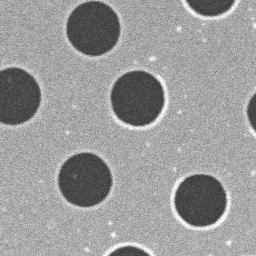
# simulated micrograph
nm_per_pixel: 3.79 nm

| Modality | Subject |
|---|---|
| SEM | holes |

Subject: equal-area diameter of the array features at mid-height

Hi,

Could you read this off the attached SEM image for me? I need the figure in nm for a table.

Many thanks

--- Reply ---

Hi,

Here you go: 204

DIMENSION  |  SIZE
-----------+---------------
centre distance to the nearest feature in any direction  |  0.341 um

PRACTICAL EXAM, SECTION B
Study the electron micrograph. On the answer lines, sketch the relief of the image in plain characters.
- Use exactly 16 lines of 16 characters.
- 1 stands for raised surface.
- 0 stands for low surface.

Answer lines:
1111100111110011
1111000111111111
1111000111111111
1111111111111111
0011111101111111
0011111000111111
0011111000111111
0011111100111111
1111111111111111
1111111111111111
1111000111111111
1111000111100011
1111001111100011
1111111111100011
1111111111111111
1111111111111111